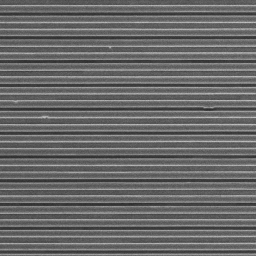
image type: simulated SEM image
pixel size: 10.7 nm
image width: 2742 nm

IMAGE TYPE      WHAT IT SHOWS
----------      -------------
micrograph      parallel lines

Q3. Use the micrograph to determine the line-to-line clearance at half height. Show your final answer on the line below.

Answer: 41.5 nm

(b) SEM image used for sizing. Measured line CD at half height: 72.3 nm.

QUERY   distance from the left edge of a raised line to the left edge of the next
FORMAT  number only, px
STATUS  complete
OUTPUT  11.9